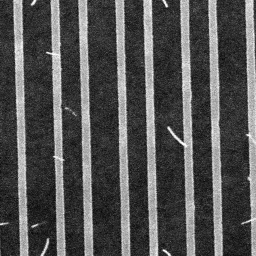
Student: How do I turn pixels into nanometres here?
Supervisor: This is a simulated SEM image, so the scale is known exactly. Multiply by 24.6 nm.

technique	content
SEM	parallel lines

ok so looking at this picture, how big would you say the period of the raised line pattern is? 32.6 px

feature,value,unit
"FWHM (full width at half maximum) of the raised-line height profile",0.179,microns